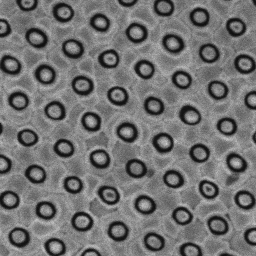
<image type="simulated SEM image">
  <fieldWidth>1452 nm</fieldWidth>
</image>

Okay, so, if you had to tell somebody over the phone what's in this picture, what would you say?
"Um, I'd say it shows a regular array of ring-shaped grooves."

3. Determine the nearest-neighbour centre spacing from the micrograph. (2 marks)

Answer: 209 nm